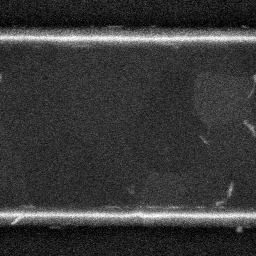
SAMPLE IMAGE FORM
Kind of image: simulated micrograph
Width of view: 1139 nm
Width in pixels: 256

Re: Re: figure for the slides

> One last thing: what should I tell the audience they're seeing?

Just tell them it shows one or a few lines or trenches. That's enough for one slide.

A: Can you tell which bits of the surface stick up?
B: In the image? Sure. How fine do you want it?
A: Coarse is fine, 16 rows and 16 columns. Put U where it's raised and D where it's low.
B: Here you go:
DDDDDDDDDDDDDDDD
DDDDDDDDDDDDDDDD
UUUUUUUUUUUUUUUU
UUUUUUUUUUUUUUUU
UUUUUUUUUUUUUUUU
UUUUUUUUUUUUUUUU
UUUUUUUUUUUUUUUU
UUUUUUUUUUUUUUUU
UUUUUUUUUUUUUUUU
UUUUUUUUUUUUUUUU
UUUUUUUUUUUUUUUU
UUUUUUUUUUUUUUUU
UUUUUUUUUUUUUUUU
DDDDDDDDDDDDDDDD
DDDDDDDDDDDDDDDD
DDDDDDDDDDDDDDDD